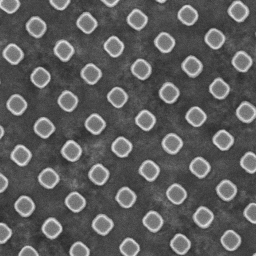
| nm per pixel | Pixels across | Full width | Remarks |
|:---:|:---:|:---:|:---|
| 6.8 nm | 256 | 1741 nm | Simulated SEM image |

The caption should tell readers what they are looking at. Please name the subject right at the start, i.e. a regular array of raised bodies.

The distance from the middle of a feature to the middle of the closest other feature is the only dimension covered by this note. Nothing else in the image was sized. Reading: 242 nanometers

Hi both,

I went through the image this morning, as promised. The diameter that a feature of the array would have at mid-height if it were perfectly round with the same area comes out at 0.128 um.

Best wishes